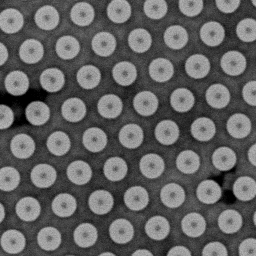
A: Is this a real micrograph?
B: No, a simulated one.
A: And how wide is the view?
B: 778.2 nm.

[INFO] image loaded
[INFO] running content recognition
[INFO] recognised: an array of small figures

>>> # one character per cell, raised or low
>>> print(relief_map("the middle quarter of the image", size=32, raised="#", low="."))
......#......####....######...##
....#####...######...######...##
...######...######...######....#
...######...######....#####.....
....#####....####...............
....####........................
............................###.
..................####.....#####
.........#####....#####....#####
#####....#####...######....#####
#####...######...######....#####
#####....#####....#####.....###.
#####....#####.....###..........
#####...........................
........................###.....
...............####....#####....
......###.....#####....######...
.....#####....######...######...
#....######...######...#####....
#....######...#####.....###.....
#....#####.....####.............
#.....###.......................
.............................###
............##......####....####
..###.....#####....######...####
.#####....######...######...####
.######...######...######....###
.######...#####.....####........
.######....####......#..........
..####..........................
.........................####...
................####....######..